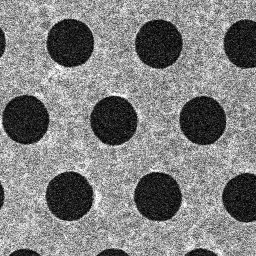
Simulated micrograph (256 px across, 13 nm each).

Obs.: holes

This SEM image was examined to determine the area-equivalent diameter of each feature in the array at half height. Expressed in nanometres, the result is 634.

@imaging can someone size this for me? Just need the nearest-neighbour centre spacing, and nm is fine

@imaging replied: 1150